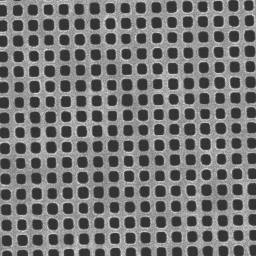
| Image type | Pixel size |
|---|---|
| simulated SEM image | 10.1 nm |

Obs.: a regular array of holes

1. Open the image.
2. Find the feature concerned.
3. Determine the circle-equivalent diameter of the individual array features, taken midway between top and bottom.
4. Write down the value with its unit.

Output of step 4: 0.11 micrometres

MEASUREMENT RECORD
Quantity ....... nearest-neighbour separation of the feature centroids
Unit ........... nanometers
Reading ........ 153